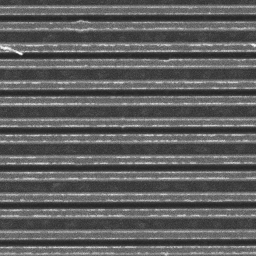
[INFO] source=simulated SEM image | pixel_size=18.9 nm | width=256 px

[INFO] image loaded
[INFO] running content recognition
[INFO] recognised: parallel lines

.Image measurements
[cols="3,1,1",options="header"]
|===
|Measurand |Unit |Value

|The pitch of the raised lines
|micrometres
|0.349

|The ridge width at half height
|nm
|161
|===